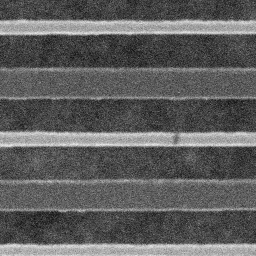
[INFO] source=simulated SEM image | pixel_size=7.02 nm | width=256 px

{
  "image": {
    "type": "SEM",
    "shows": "lines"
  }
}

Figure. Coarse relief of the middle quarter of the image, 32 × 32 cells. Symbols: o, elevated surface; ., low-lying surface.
................................
oooooooooooo...ooooooooooooooooo
oooooooooooooooooooooooooooooooo
oooooooooooooooooooooooooooooooo
oooooooooooooooooooooooooooooooo
oooooooooooooooooooooooooooooooo
oooooooooooooooooooooooooooooooo
oooooooooooooooooooooooooooooooo
.......oo.................ooooo.
................................
................................
................................
................................
................................
................................
................................
................................
o.o...o..............oooo.......
oooooooooooooooooooooooooooooooo
oooooooooooooooooooooooooooooooo
................................
................................
................................
................................
................................
................................
................................
................................
................................
ooo....oo.ooooooooo...o.oooooooo
oooooooooooooooooooooooooooooooo
oooooooooooooooooooooooooooooooo